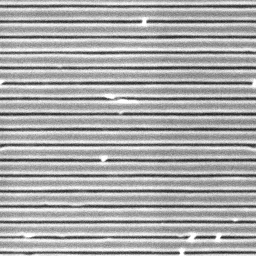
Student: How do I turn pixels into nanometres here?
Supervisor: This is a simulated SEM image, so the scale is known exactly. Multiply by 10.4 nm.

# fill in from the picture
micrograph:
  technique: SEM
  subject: parallel lines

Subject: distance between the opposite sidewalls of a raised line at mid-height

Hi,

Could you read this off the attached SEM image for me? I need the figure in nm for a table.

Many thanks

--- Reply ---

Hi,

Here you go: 113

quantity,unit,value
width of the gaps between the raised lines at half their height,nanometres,44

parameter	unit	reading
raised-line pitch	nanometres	160